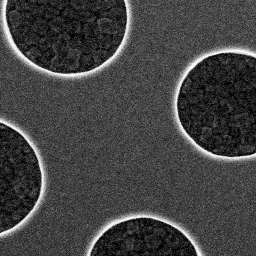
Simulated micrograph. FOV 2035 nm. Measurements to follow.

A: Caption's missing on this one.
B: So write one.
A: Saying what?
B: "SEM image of holes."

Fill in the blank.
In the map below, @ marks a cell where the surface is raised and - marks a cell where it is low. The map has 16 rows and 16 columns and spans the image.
--------@@@@@@@@
--------@@@@@@@@
@-------@@@@@@@@
@@-----@@@@@@---
@@@--@@@@@@@----
@@@@@@@@@@@-----
@@@@@@@@@@@-----
@@@@@@@@@@@-----
-@@@@@@@@@@@----
--@@@@@@@@@@@---
--@@@@@@@@@@@@@@
---@@@@@@@@@@@@@
--@@@@@@@@@@@@@@
--@@@@@@@@@@@@@@
@@@@@@@----@@@@@
@@@@@@------@@@@